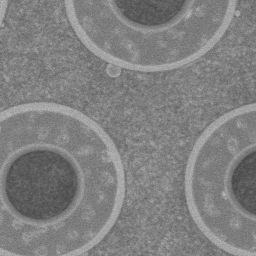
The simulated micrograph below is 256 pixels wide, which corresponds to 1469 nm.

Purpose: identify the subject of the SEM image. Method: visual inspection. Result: ring-shaped raised bodies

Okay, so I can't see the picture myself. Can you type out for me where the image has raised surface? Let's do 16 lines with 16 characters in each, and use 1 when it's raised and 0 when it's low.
0000111000001100
0000011100111100
0000011111111000
0000000111110000
0000000000000000
0000000000000000
0000000000000000
1111100000000011
1111111000000111
1000111000001110
0000011000001110
0000011100001100
0000011000001110
1000111000001111
1111111000000111
1111100000000011